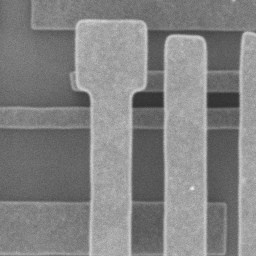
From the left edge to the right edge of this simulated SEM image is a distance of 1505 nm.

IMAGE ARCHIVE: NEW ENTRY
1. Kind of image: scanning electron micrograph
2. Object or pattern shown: wiring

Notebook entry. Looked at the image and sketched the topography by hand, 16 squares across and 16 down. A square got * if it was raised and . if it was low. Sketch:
................
.....****.......
.....****.***..*
.....****.***..*
.....****.***..*
.....****.***..*
......**..***..*
......**..***..*
......**..***..*
......**..***..*
......**..***..*
......**..***..*
......**..***..*
......**..***..*
......**..***..*
......**..***..*